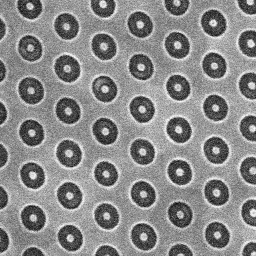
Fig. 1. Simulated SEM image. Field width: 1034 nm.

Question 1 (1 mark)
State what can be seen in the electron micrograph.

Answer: a regular array of ring-shaped grooves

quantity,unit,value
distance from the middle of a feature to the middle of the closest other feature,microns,0.17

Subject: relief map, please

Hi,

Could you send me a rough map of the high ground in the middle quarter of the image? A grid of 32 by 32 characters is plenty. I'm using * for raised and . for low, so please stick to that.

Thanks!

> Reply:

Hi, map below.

....************..**..**********
**..************.......*********
....*************.....**********
....****....******....****....**
..*****......*************.....*
*******......************...*...
*******..**..*************..*...
*******......*************.....*
.*******.....****....******....*
...******...*****.....**********
....************.......*********
**..************...*...*********
....*************......*********
....*****..******.....*****...**
...*****....******...*****.....*
*******......************.......
*******...*..************...*...
*******...*...************......
********.....*************......
...*****.....****.....*****....*
....*************.....**********
....************...*...*********
**...************..*...*********
.....************......*********
....*****..*******....*****....*
...*****.....*************......
*******......*************..*...
*******...*...************..*...
********......************......
..******.....*****...******.....
....******..*****.....*******.**
....*************......*********